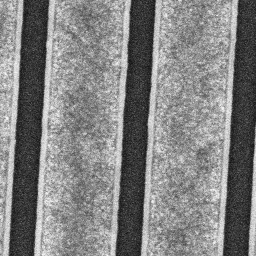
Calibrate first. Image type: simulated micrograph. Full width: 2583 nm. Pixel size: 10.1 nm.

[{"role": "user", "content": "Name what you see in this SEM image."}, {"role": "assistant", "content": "one or a few lines or trenches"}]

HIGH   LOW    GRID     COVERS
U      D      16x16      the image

UDDUUUUUDDUUUUUD
UDDUUUUUDDUUUUUD
UDDUUUUUDDUUUUUD
UDDUUUUUDDUUUUDD
UDDUUUUUDDUUUUDD
UDDUUUUUDDUUUUDD
UDDUUUUUDDUUUUDD
UDDUUUUUDUUUUUDD
UDDUUUUUDUUUUUDD
UDDUUUUDDUUUUUDD
UDDUUUUDDUUUUUDD
UDDUUUUDDUUUUUDD
UDDUUUUDDUUUUUDD
UDUUUUUDDUUUUUDD
DDUUUUUDDUUUUUDD
DDUUUUUDDUUUUUDD